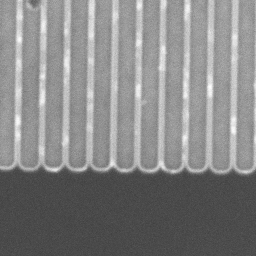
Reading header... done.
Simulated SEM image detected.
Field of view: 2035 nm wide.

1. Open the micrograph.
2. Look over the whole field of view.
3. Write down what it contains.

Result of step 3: parallel lines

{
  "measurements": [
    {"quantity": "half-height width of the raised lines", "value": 35.7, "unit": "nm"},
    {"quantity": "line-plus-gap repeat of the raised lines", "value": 190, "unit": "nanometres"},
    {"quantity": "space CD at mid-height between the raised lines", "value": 157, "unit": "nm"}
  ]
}